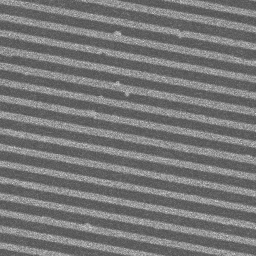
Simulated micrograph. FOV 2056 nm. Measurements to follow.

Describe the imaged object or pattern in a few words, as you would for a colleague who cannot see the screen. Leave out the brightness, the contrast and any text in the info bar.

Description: parallel lines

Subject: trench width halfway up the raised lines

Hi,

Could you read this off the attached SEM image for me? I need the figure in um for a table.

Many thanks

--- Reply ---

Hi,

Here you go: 0.079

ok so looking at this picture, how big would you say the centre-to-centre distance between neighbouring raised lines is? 129 nm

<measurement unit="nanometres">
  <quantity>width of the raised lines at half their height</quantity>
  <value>55.3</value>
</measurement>